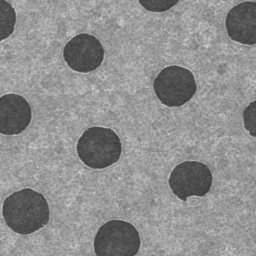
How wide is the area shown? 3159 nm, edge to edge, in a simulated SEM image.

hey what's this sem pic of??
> holes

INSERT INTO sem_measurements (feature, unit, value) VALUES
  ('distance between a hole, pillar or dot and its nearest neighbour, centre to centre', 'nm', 1180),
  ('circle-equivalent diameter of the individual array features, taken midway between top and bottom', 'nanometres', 521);